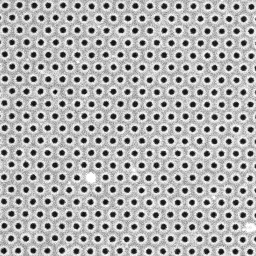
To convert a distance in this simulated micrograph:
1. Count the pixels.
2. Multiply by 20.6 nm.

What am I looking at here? a regular array of holes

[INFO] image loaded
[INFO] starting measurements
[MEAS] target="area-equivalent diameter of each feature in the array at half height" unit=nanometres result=138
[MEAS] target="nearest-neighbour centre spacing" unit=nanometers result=286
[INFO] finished